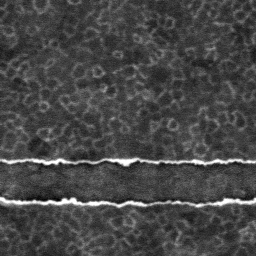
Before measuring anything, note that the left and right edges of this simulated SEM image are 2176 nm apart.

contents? one or a few lines or trenches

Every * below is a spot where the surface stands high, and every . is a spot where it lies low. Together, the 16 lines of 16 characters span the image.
****************
****************
****************
****************
****************
****************
****************
****************
****************
****************
................
................
*...*.........*.
****************
****************
****************